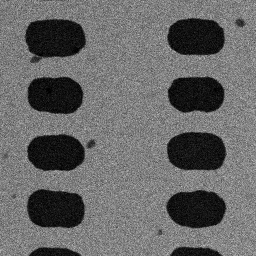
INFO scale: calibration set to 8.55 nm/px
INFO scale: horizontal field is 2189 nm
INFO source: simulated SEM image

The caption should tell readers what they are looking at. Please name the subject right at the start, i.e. a regular array of holes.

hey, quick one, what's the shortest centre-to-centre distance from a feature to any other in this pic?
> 0.488 microns